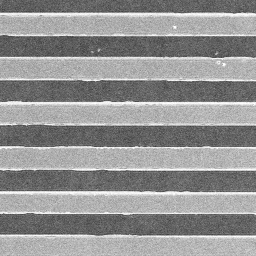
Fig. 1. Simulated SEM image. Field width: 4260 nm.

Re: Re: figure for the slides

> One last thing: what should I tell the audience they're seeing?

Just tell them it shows lines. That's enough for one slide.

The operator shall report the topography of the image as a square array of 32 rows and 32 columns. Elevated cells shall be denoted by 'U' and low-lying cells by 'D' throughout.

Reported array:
DDDDDDDDDDDDDDDDDDDDDDDDDDDDDDDD
DDDDDDDDDDDDDDDDDDDDDDDDDDDDDDDD
UUUUUUUUUUUUUUUUUUUUUUUUUUUUUUUU
UUUUUUUUUUUUUUUUUUUUUUUUUUUUUUUU
DDDDDDDDDDDDDDDDDDDDDDDDDDDDDDDD
DDDDDDDDDDDDDDDDDDDDDDDDDDDDDDDD
DDDDDDDDDDDDDDDDDDDDDDDDDDDDDDDD
UUUUUUUUUUUUUUUUUUUUUUUUUUUUUUUU
UUUUUUUUUUUUUUUUUUUUUUUUUUUUUUUU
UUUUUUUUUUUUUUUUUUUUUUUUUUUUUUUU
DDDDDDDDDDDDDDDDDDDDDDDDDDDDDDDD
DDDDDDDDDDDDDDDDDDDDDDDDDDDDDDDD
DDDDDDDDDDDDDDDDDDDDDDDDDDDDDDDD
UUUUUUUUUUUUUUUUUUUUUUUUUUUUUUUU
UUUUUUUUUUUUUUUUUUUUUUUUUUUUUUUU
UUDUDUUUUUUUUUUUUUUUUUUUUUUUUUUU
DDDDDDDDDDDDDDDDDDDDDDDDDDDDDDDD
DDDDDDDDDDDDDDDDDDDDDDDDDDDDDDDD
UUUUUUUUUUUUUUUUUUUUUUUUUUUUUUUU
UUUUUUUUUUUUUUUUUUUUUUUUUUUUUUUU
UUUUUUUUUUUUUUUUUUUUUUUUUUUUUUUU
DDDDDDDDDDDDDDDDDDDDDDDDDDDDDDDD
DDDDDDDDDDDDDDDDDDDDDDDDDDDDDDDD
DDDDDDDDDDDDDDDDDDDDDDDDDDDDDDDD
UUUUUUUUUUUUUUUUUUUUUUUUUUUUUUUU
UUUUUUUUUUUUUUUUUUUUUUUUUUUUUUUU
UUUUUUUUUUUUUUUUUUUUUUUUUUUUUUUU
DDDDDDDDDDDDDDDDDDDDDDDDDDDDDDDD
DDDDDDDDDDDDDDDDDDDDDDDDDDDDDDDD
UUUUUUUUUUUUDDUUDDDDDDDDDDDDDDDD
UUUUUUUUUUUUUUUUUUUUUUUUUUUUUUUU
UUUUUUUUUUUUUUUUUUUUUUUUUUUUUUUU